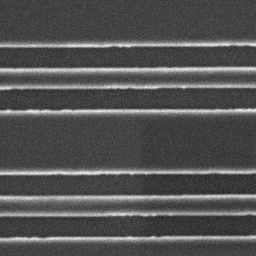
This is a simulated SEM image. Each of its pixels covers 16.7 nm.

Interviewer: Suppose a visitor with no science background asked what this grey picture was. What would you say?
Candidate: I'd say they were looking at lines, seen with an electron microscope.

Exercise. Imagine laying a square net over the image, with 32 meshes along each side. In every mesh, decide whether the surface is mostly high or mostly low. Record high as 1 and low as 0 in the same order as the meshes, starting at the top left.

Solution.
11111111111111111111111111111111
11111111111111111111111111111111
11111111111111111111111111111111
11111111111111111111111111111111
11111111111111111111111111111111
11111111111111111111111111111111
00000000000000000000000000000000
00000000000000000000000000000000
00000000000000000000000000000000
11111111111111111111111111111111
11111111111111111111111111111111
00000000000000000000000000000000
00000000000000000000000000000000
00000000000000000000000000000000
11111111111111111111111111111111
11111111111111111111111111111111
11111111111111111111111111111111
11111111111111111111111111111111
11111111111111111111111111111111
11111111111111111111111111111111
11111111111111111111111111111111
11111111111111111111111111111111
00000000000000000000000000000000
00000000000000000000000000000000
00000000000000000000000000001111
11111111111111111111111111111111
11111111111111111111111111111111
00000000000000000000000000000000
00000000000000000000000000000000
00000000000000000000000000000000
11111111111111111111111111111111
11111111111111111111111111111111